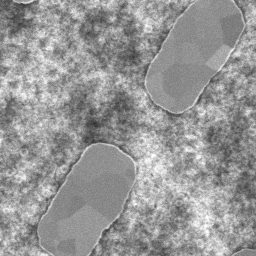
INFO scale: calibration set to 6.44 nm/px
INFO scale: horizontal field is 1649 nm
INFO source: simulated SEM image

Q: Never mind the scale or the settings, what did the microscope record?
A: raised bodies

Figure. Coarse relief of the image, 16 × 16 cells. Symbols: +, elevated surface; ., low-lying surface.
............+++.
...........++++.
..........+++++.
..........++++..
.........+++++..
.........++++...
..........++....
................
................
.....+++........
.....+++........
....++++........
...+++++........
...++++.........
..++++..........
...+++..........